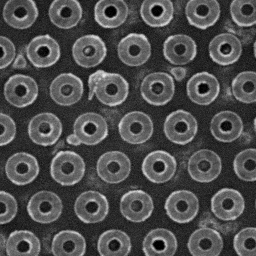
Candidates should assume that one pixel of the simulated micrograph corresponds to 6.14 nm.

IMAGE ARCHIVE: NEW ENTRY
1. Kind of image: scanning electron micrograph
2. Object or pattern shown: a regular array of ring-shaped raised bodies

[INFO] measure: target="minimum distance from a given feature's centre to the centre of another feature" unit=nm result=275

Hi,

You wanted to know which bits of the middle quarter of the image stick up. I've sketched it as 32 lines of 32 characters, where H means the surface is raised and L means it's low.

LLLLLHHHLLLLLLLLLLLLLLLLLLLLLLLL
LLLLLLLLLLLLLLLLLLLLLLLLLLLLHLLL
LHLLLLLHHHHHLLLLLLLLLLHHHHLHHHLL
HHHHLLHHHHHHHHHLLLLLHHHHHHHLHLLL
HHHHLLHHHHHHHHHLLLLLHHHLHHHLLLLH
LLHHHLHHHHHLLHHHLLLHHHLLLHHLLLLH
LLHHHLLHHHLLLLHHLLLHHHLLLHHLLLLH
LLHHLLHLHHHLLHHHLLLHHHHLHHHLLLLH
HHHHLLLLLHHHHHHLLLLLHHHHHHHLLLLL
HHHLLLLLLLHHHHLLLLLLLHHHHHLLLLLL
LLLLLLLLLLLHLLLLLLLLLLLLLLLLLLLL
LLLLLLLLLLLLLLLLLLLLLLLLLLLLLLLL
LLLLLHHHLLLLLLLLHHHHLLLLLLLHHHHH
LLLLHHHHHHLLLLLHHHHHHLLLLLHHHHHH
LLLHHHHHHHLLLLHHHHLHHHLLLHHHLLHH
LLLHHLLLHHHLLLHHLLLLHHLLLHHHLLLH
LLLHHLLLHHHLLLHHLLLLHHLLLHHHLLLH
LLLHHHLHHHHLLLHHHLHHHHLLLLHHHLHH
LHHHHHHHHHLLLLLHHHHHHLLLLLHHHHHH
LHHLHHHHHLLLLLLLLHHHLLLLLLLLHHHL
LLLLLLLLLLLLLLLLLLLLLLLLLLLLLLLL
LLLLLLLLLLLLLLLLLLLLLLLLLLLLLLLL
HHHLLLLLLLHHHHHLLLLLLHHHHHLLLLLL
HHHHLLLLLHHHHHHHLLLLLHHHHHHLLLLL
LHHHHLLLLHHHLHHHLLLLHHHLLHHHLLLH
LLHHHLLLLHHLLLHHLLLLHHLLLHHHLLLH
LLHHHLLLLHHLLLHHLLLLHHLLLHHHLLLH
LLHHHLLLLHHHHHHHLLLLHHHHHHHLLLLL
HHHHLLLLLHHHHHHLLLLLLHHHHHHLLLLL
HHHLLLLLLLLHHHLLLLLLLLLHLLLLLLLL
LLLLLLLLLLLLLLLLLLLLLLLLLLLLLLLL
LLLLLLLLLLLLLLLLLLLLLLLLLLLLLLLL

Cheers